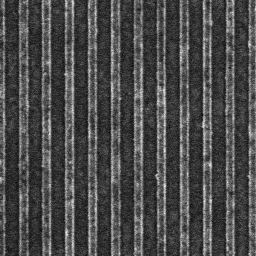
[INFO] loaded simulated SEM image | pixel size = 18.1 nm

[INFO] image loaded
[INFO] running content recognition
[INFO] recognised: parallel lines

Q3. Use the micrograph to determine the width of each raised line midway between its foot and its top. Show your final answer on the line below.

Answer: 0.133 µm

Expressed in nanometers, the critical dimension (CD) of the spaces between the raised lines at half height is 284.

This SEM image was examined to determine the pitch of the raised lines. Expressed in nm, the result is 414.